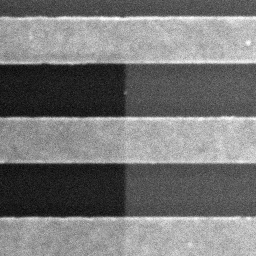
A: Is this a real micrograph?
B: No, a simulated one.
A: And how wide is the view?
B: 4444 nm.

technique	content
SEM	lines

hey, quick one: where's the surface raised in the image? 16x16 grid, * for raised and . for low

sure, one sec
................
****************
****************
****************
................
................
................
****************
****************
****************
................
................
................
................
****************
****************